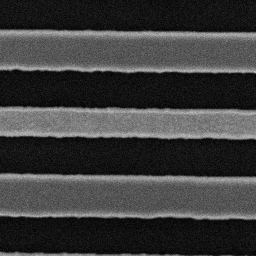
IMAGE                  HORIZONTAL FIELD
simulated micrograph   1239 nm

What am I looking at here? lines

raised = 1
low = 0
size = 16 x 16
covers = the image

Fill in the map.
0000000000000000
0000000000000000
1111111111111111
1111111111111111
0000000111111111
0000000000000000
0000000000000000
1111111111111111
1111111111111111
0000000000000000
0000000000000000
1111111111111111
1111111111111111
1111111111111111
0000000000000000
0000000000000000